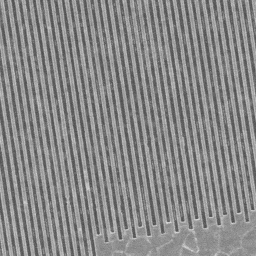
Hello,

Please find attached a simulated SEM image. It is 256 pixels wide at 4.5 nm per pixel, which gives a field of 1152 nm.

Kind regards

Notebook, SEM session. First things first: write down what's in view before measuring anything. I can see parallel lines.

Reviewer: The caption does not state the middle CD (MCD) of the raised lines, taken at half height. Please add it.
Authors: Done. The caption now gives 13.9 nanometres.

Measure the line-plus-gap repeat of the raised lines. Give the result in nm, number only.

32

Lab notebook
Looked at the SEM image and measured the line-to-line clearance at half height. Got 17.9 nm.